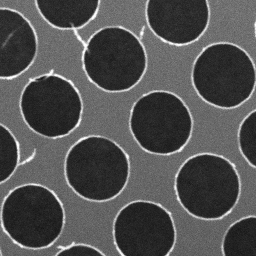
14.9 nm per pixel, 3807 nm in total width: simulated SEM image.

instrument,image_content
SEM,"holes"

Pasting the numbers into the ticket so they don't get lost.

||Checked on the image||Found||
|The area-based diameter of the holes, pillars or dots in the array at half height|926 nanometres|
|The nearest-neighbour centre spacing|1170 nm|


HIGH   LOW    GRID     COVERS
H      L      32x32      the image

HHHHHLLLLLLLHHHHHHHLLLLLLLHHHHHH
LLHHHLLLLLLLHHHHHHLLLLLLLLHHHHHH
LLLHHHLLLLLHHHHHHHLLLLLLLLHHHHHH
LLLLHHHHLHHHHLLHHHHLLLLLLLHHHHHH
LLLLHHHHHHHHLLLLLHHHLLLLLHHHHHHH
LLLLHHHHHHHLLLLLLLHHHHHHHHHLHHHH
LLLLHHHHHHHLLLLLLLHHHHHHHLLLLLLH
LLLLHHHHHHLLLLLLLLHHHHHHHLLLLLLH
LLLHHHHHHHHLLLLLLLHHHHHHLLLLLLLL
LHHHHHLHHHHLLLLLLLHHHHHHLLLLLLLL
HHHHLLLLLHHHLLLLLHHHHHHHLLLLLLLL
HHHLLLLLLLHHHHHHHHHHHHHHHLLLLLLH
HHHLLLLLLLHHHHHHHLLLLLHHHHLLLLLH
HHHLLLLLLLHHHHHHHLLLLLLHHHHHHHHH
HHHLLLLLLLHHHHHHLLLLLLLLHHHHHHHL
HHHHLLLLLLHHHHHHLLLLLLLLHHHHHHLL
LHHHHLLLLHHHHHHHHLLLLLLLHHHHHHLL
LLHHHHHHHHLLLLHHHLLLLLLHHHHHHHLL
LLHHHHHHHLLLLLLHHHLLLLHHHHHHHHLL
LLHHHHHHLLLLLLLLHHHHHHHHHLLHHHHL
LLHHHHHHLLLLLLLLHHHHHHHLLLLLLHHH
LLHHHHHHLLLLLLLLHHHHHHLLLLLLLHHH
LHHHHHHHHLLLLLLLHHHHHHLLLLLLLLHH
HHLLLLHHHLLLLLLHHHHHHHLLLLLLLLHH
HLLLLLLHHHLLLLHHHHHHHHLLLLLLLLHH
HLLLLLLHHHHHHHHHLLLHHHHLLLLLLHHH
LLLLLLLLHHHHHHHLLLLLLHHHLLLLHHHH
LLLLLLLLHHHHHHLLLLLLLHHHHHHHHHLL
HLLLLLLLHHHHHHLLLLLLLLHHHHHHHLLL
HLLLLLLHHHHHHHLLLLLLLLHHHHHHLLLL
HHHLLLHHHHHHHHHLLLLLLLHHHHHHLLLL
HHHHHHHHLLLLHHHLLLLLLHHHHHHHLLLL